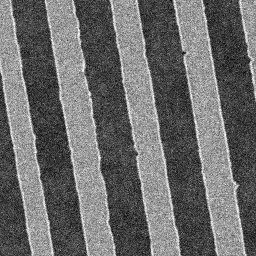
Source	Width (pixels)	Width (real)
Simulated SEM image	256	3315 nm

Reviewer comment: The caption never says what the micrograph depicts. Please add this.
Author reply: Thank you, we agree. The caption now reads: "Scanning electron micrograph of one or a few lines or trenches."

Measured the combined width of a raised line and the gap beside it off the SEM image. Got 808 nm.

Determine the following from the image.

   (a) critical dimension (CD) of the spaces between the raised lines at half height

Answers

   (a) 477 nm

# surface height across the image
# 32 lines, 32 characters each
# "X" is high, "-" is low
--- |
X-----XXX-----XXX-----XXX-----XX
X-----XXX-----XXX-----XXX-----XX
XX----XXXX----XXX-----XXXX----XX
XX----XXXX----XXXX----XXXX-----X
XX----XXXX-----XXX-----XXX-----X
XX-----XXX-----XXX-----XXX-----X
XX-----XXX-----XXX-----XXX-----X
XX-----XXX-----XXX-----XXX-----X
XXX----XXX-----XXX-----XXXX----X
XXX----XXXX----XXXX----XXXX-----
-XX----XXXX-----XXX-----XXX-----
-XX-----XXX-----XXX-----XXX-----
-XX-----XXX-----XXX-----XXX-----
-XXX----XXX-----XXX-----XXXX----
-XXX----XXXX----XXXX----XXXX----
-XXX----XXXX----XXXX----XXXX----
-XXX----XXXX-----XXX-----XXX----
--XX-----XXX-----XXX-----XXX----
--XX-----XXX-----XXX-----XXX----
--XX-----XXX-----XXX-----XXXX---
--XXX----XXX-----XXXX----XXXX---
--XXX----XXXX----XXXX----XXXX---
--XXX-----XXX-----XXX-----XXX---
---XX-----XXX-----XXX-----XXX---
---XX-----XXX-----XXX-----XXX---
---XXX----XXX-----XXX-----XXXX--
---XXX----XXXX----XXXX----XXXX--
---XXX----XXX------XXX----XXXX--
---XXX----XXXX-----XXX-----XXX--
----XX-----XXX-----XXX-----XXX--
----XX-----XXX-----XXX-----XXX--
----XX-----XXX-----XXX-----XXXX-